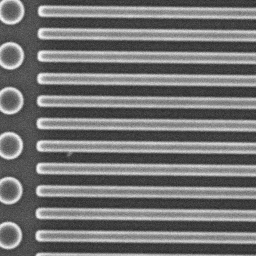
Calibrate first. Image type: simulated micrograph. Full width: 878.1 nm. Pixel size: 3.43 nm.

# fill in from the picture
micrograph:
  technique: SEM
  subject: groups of lines, slits or small figures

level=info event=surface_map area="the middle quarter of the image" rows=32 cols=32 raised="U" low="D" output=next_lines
DDDDDDDDDDDDDDDDDDDDDDDDDDDDDDDD
DDDDDDDDDDDDDDDDDDDDDDDDDDDDDDDD
DDDDDDDDDDDDDDDDDDDDDDDDDDDDDDDD
UUUUUUUUUUUUUUUUUUUUUUUUUUUUUUUU
UUUUUUUUUUUUUUUUUUUUUUUUUUUUUUUU
DDDDDDDDDDDDDDDDDDDDDDDDDDDDDDDD
DDDDDDDDDDDDDDDDDDDDDDDDDDDDDDDD
DDDDDDDDDDDDDDDDDDDDDDDDDDDDDDDD
UUUUUUUUUUUUUUUUUUUUUUUUUDDDDDDD
UUUUUUUUUUUUUUUUUUUUUUUUUUUUUUUU
DDDDUUUUUUUUUUUUUUUUUUUUUUUUUUUU
DDDDDDDDDDDDDDDDDDDDDDDDDDDDDDDD
DDDDDDDDDDDDDDDDDDDDDDDDDDDDDDDD
DDDDDDDDDDDDDDDDDDDDDDDDDDDDDDDD
UUUUUUUUUUUUUUUUUUUUUUUUUUUUUUUU
UUUUUUUUUUUUUUUUUUUUUUUUUUUUUUUU
DDDDDDDDDDDDDDDDDDDDDDDDDDDDDDDD
DDDDDDDDDDDDDDDDDDDDDDDDDDDDDDDD
DDDDDDDDDDDDDDDDDDDDDDDDDDDDDDDD
UUUDDDDDDDDDDDDDDDDDDDDDDDDDDDDD
UUUUUUUUUUUUUUUUUUUUUUUUUUUUUUUU
UUUUUUUUUUUUUUUUUUUUUUUUUUUUUUUU
DDDDDDDDDDDDDDDDDDDDDDDDDDDDDDDD
DDDDDDDDDDDDDDDDDDDDDDDDDDDDDDDD
DDDDDDDDDDDDDDDDDDDDDDDDDDDDDDDD
UUUUUUUUUUUUUUUUUUUUUUUUUUUUUUUU
UUUUUUUUUUUUUUUUUUUUUUUUUUUUUUUU
DDDDDDDDDDDDUUUUUUUUUUUUUUUUUUUU
DDDDDDDDDDDDDDDDDDDDDDDDDDDDDDDD
DDDDDDDDDDDDDDDDDDDDDDDDDDDDDDDD
DDDDDDDDDDDDDDDDDDDDDDDDDDDDDDDD
UUUUUUUUUUUUUUUUUUUUUUUUUUUUUUUU